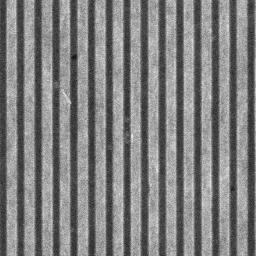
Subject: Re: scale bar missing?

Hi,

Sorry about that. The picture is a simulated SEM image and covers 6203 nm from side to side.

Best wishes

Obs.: parallel lines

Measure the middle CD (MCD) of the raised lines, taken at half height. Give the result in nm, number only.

239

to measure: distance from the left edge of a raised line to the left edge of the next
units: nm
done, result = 430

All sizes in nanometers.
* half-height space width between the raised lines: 191